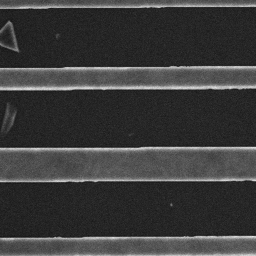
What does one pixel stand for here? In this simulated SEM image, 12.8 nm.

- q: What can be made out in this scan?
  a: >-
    lines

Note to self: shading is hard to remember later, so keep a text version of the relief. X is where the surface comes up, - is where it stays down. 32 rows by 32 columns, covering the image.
XXXXXXXXXXXXXXXXXXXXXXXXXXXXXXXX
--------------------------------
--------------------------------
--------------------------------
--------------------------------
--------------------------------
--------------------------------
--------------------------------
----------XXXXXXXXXXXXXXXXXXXXXX
XXXXXXXXXXXXXXXXXXXXXXXXXXXXXXXX
XXXXXXXXXXXXXXXXXXXXXXXXXXXXXXXX
--------------------------------
--------------------------------
--------------------------------
--------------------------------
--------------------------------
--------------------------------
--------------------------------
------------------XXXXXXXXXXXXXX
XXXXXXXXXXXXXXXXXXXXXXXXXXXXXXXX
XXXXXXXXXXXXXXXXXXXXXXXXXXXXXXXX
XXXXXXXXXXXXXXXXXXXXXXXXXXXXXXXX
XXXXXXXXXXXXXXXXXXXXXXXXXXXXXXXX
--------------------------------
--------------------------------
--------------------------------
--------------------------------
--------------------------------
--------------------------------
--------------------------------
XXXXXXXXXXXXXXXXXXXXXXXXXXXXXXXX
XXXXXXXXXXXXXXXXXXXXXXXXXXXXXXXX